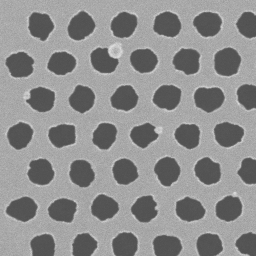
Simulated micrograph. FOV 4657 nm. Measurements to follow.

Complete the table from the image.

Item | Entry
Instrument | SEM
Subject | a regular array of holes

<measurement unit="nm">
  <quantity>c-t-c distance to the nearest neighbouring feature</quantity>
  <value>737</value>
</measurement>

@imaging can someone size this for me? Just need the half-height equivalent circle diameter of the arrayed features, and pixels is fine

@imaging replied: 26.3